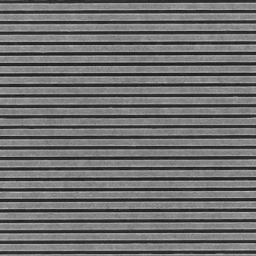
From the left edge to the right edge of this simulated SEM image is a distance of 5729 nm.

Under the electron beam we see parallel lines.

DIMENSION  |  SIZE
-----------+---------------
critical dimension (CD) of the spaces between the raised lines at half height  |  0.0979 microns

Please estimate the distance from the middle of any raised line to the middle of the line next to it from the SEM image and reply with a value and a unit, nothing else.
234 nm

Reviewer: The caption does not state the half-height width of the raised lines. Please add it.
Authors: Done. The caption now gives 137 nm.